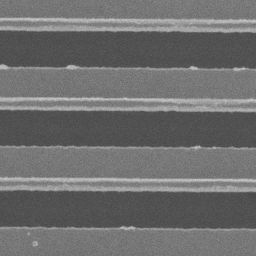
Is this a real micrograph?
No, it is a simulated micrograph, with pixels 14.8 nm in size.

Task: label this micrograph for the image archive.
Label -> lines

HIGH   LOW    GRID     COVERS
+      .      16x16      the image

++++++++++++++++
++++++++++++++++
................
................
++++++++++++++++
++++++++++++++++
++++++++++++++++
................
................
++++++++++++++++
++++++++++++++++
++++++++++++++++
................
................
++++++++++++++++
++++++++++++++++